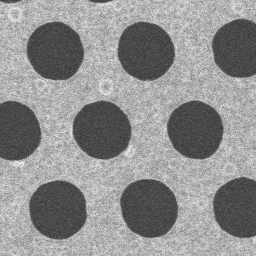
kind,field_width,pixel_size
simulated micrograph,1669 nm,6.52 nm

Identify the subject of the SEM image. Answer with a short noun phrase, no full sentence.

holes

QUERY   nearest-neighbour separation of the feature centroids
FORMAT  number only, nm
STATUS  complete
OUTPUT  591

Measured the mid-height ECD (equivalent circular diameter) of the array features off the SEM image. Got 0.382 um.